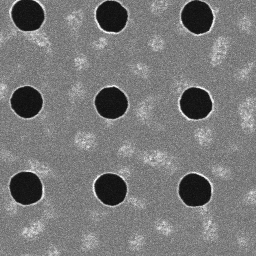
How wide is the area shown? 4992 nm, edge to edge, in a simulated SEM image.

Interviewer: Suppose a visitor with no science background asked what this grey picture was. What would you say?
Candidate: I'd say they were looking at holes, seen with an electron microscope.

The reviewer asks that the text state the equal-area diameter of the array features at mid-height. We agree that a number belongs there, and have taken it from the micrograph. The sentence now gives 0.634 micrometres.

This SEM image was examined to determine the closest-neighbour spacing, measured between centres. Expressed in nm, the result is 1650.